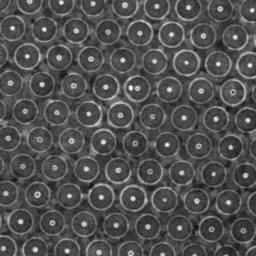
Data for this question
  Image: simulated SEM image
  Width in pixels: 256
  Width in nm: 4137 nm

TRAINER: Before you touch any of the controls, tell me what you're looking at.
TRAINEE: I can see an array of small figures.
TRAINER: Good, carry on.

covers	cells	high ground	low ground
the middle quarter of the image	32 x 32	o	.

.ooo.....ooo.....ooo.....ooo....
ooooo...ooooo...ooooo....ooo....
oo.oooooooooooooooooooooooooo...
.....oooo....oooo...oooooo.ooooo
.....ooo.....ooo.....ooo.....ooo
..o..oo...o...o......ooo.....ooo
.....ooo......o......oo......oo.
.....ooo.....oo......ooo.....oo.
oo.oooooo...oooo....oooo.....ooo
oooooo.ooooooooooooooooooooooooo
.ooo.....ooo....oooo...ooooooo.o
.oo......oo......oo......ooo....
.oo.......o......oo......oo.....
.oo......oo......oo......oo.....
oooo.....oo......oo......oo.....
oooooo.ooooo....oooo....oooo....
o..oooooo..oooooooooooooooooo.oo
....oooo....oooo....oooo...ooooo
.....oo......oo.....ooo.....ooo.
.o...oo..o...oo......oo......oo.
.....oo......oo......oo......oo.
....oooo....ooo.....ooo.....ooo.
ooooooooo.oooooo...ooooo....oooo
oooo...ooooooooooooooooooooooooo
ooo.....ooo.....oooo...ooooo...o
.oo......oo.....ooo.....ooo.....
.oo......o...o...oo......oo.....
ooo.....ooo......oo.....oo......
oooo....ooo.....ooo.....ooo.....
oooooooooooo...ooooo...ooooo...o
...ooooo...oooooo.oooooooooooooo
....ooo.....ooo.....ooo....ooooo